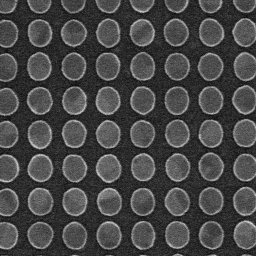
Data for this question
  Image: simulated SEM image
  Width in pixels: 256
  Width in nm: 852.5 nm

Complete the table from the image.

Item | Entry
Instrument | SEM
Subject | a regular array of raised bodies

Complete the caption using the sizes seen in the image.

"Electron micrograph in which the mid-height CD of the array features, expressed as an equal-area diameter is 85.3 nanometers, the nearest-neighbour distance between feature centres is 111 nm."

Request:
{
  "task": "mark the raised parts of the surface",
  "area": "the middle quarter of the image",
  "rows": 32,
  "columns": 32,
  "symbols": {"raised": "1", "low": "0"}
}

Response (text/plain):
11111000111111000111111001111110
11111000111111000111111001111110
11111000111110000111110000111110
01110000011110000011100000011100
00000000000000000000000000000000
00000000000000000000000000000000
01110000011110000011100000111100
11111000111111000111110000111110
11111000111111000111111001111110
11111000111111000111111001111110
11111000111111000111110001111110
11111000011110000011110000111100
00000000001100000001000000000000
00000000000000000000000000000000
01110000001100000011100000011100
11111000011110000111110000111110
11111000111111000111110000111110
11111100111111000111110001111110
11111000111111000111110001111110
11111000011111000111110000111110
01110000001110000011100000011100
00000000000000000000000000000000
00000000000000000001000000000000
11110000011110000011110000111100
11111000111111000111110000111110
11111100111111000111110000111110
11111100111111000111110000111110
11111000111111000111110000111110
01111000011110000011110000011100
00100000000000000000000000000000
00000000000000000000000000000000
01110000001110000011100000011000